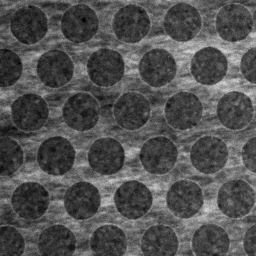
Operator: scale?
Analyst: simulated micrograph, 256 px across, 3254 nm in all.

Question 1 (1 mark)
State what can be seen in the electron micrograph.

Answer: a regular array of raised bodies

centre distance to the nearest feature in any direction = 0.642 micrometres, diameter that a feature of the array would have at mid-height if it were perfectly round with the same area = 501 nm